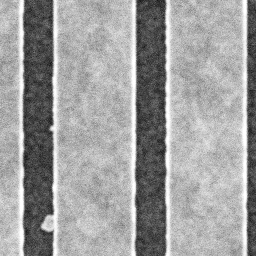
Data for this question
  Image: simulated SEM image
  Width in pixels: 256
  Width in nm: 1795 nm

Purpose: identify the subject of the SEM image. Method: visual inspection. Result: lines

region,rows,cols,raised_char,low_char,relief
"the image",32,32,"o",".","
ooo....oooooooooo....oooooooooo.
ooo....oooooooooo....oooooooooo.
ooo....oooooooooo....oooooooooo.
ooo....oooooooooo....oooooooooo.
ooo....oooooooooo....oooooooooo.
ooo....oooooooooo....oooooooooo.
ooo....oooooooooo....oooooooooo.
ooo....oooooooooo....oooooooooo.
ooo....oooooooooo....oooooooooo.
ooo....oooooooooo....oooooooooo.
ooo....oooooooooo....oooooooooo.
ooo....oooooooooo....oooooooooo.
ooo....oooooooooo....oooooooooo.
ooo....oooooooooo....oooooooooo.
ooo....oooooooooo....oooooooooo.
ooo....oooooooooo....oooooooooo.
ooo....oooooooooo....oooooooooo.
ooo....oooooooooo....oooooooooo.
ooo....oooooooooo....oooooooooo.
ooo....oooooooooo....oooooooooo.
ooo....oooooooooo....oooooooooo.
ooo....oooooooooo....oooooooooo.
ooo....oooooooooo....oooooooooo.
ooo....oooooooooo....oooooooooo.
ooo....oooooooooo....oooooooooo.
ooo....oooooooooo....oooooooooo.
ooo....oooooooooo....oooooooooo.
ooo....oooooooooo....oooooooooo.
ooo....oooooooooo....oooooooooo.
ooo....oooooooooo....oooooooooo.
ooo....oooooooooo....oooooooooo.
ooo....oooooooooo....oooooooooo.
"